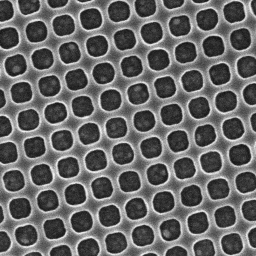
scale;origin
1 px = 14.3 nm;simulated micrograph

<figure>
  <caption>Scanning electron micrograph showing a regular array of holes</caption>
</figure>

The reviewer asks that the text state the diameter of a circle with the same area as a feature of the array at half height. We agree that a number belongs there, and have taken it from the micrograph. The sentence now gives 321 nanometers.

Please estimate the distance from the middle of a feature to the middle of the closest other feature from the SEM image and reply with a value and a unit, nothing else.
396 nanometres